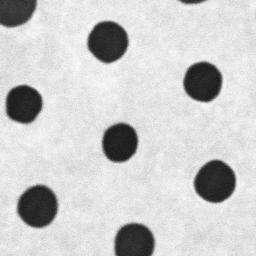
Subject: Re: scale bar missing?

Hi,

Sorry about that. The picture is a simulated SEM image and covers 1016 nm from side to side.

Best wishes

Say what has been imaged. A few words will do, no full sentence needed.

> holes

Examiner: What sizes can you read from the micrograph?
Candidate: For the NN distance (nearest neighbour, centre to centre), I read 0.403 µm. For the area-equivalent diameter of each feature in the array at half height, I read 158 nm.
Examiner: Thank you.